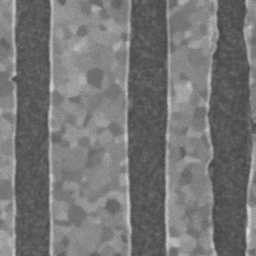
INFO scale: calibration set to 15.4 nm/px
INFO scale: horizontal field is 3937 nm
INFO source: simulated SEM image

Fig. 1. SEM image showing one or a few lines or trenches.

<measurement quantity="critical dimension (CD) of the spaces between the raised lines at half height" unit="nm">577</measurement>